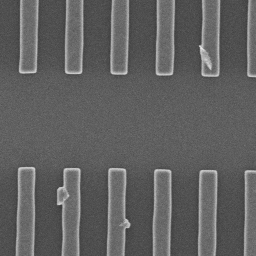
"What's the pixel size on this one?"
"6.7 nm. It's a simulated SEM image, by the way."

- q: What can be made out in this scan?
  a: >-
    groups of lines, slits or small figures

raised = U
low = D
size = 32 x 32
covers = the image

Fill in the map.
DDDUUDDDUUDDDDUUDDDDUUDDDUUDDDDU
DDDUUDDDUUDDDDUUDDDDUUDDDUUDDDDU
DDDUUDDDUUDDDDUUDDDDUUDDDUUDDDDU
DDDUUDDDUUDDDDUUDDDDUUDDDUUDDDDU
DDDUUDDDUUDDDDUUDDDDUUDDDUUDDDDU
DDDUUDDDUUDDDDUUDDDDUUDDDUUDDDDU
DDDUUDDDUUDDDDUUDDDDUUDDDUUDDDDU
DDUUUDDDUUDDDDUUDDDDUUDDDUUDDDDU
DDUUUDDDUUDDDDUUDDDDUUDDDUUDDDDU
DDDDDDDDDDDDDDDDDDDDDDDDDDDDDDDU
DDDDDDDDDDDDDDDDDDDDDDDDDDDDDDDD
DDDDDDDDDDDDDDDDDDDDDDDDDDDDDDDD
DDDDDDDDDDDDDDDDDDDDDDDDDDDDDDDD
DDDDDDDDDDDDDDDDDDDDDDDDDDDDDDDD
DDDDDDDDDDDDDDDDDDDDDDDDDDDDDDDD
DDDDDDDDDDDDDDDDDDDDDDDDDDDDDDDD
DDDDDDDDDDDDDDDDDDDDDDDDDDDDDDDD
DDDDDDDDDDDDDDDDDDDDDDDDDDDDDDDD
DDDDDDDDDDDDDDDDDDDDDDDDDDDDDDDD
DDDDDDDDDDDDDDDDDDDDDDDDDDDDDDDD
DDDDDDDDDDDDDDDDDDDDDDDDDDDDDDDD
DDUUDDDDUUDDDDUUDDDUUDDDDUUDDDDU
DDUUDDDDUUDDDDUUDDDUUDDDDUUDDDDU
DDUUDDDUUUDDDDUUDDDUUDDDDUUDDDDU
DDUUDDDUUUDDDDUUDDDUUDDDDUUDDDDU
DDUUDDDUUUDDDDUUDDDUUDDDDUUDDDDU
DDUUDDDDUUDDDDUUDDDUUDDDDUUDDDDU
DDUUDDDDUUDDDDUUDDDUUDDDDUUDDDDU
DDUUDDDDUUDDDDUUDDDUUDDDDUUDDDDU
DDUUDDDDUUDDDUUUDDDUUDDDDUUDDDDU
DDUUDDDDUUDDDUUUDDDUUDDDDUUDDDDU
DDUUDDDDUUDDDUUDDDDUUDDDDUUDDDDU